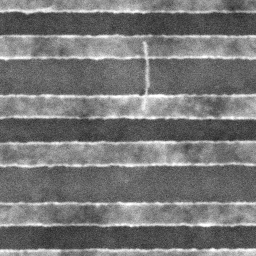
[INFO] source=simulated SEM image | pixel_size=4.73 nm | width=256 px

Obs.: lines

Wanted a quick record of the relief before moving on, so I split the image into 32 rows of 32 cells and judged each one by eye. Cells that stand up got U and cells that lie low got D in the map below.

UUUUUUUUUUUUUUUUUUUUUUUUUUUUUUUU
DDDUDDDDDDDDDDUDUUDDDUDUUUDDUDDU
DDDDDDDDDDDDDDDDDDDDDDDDDDDDDDDD
DDDDDDDDDDDDDDDDDDDDDDDDDDDDDDDD
DDDDDDDDDDDDDDUDDDDDUDDDDDDDDDDD
UUUUUUUUUUUUUUUUUUUUUUUUUUUUUUUU
UUUUUUUUUUUUUUUUUUUUUUUUUUUUUUUU
DDDDDDDDDDDDDDDDDDDDDDDDDDDDDDDD
DDDDDDDDDDDDDDDDDDDDDDDDDDDDDDDD
DDDDDDDDDDDDDDDDDDDDDDDDDDDDDDDD
DDDDDDDDDDDDDDDDDDDDDDDDDDDDDDDD
DDDDDDDDDDDDDDDDDDDDDDDDDDDDDDDD
UUUUUUUUUUUUUUUUUUUUUUUUUUUUUUUU
UUUUUUUUUUUUUUUUUUUUUUUUUUUUUUUU
UUUUUUUUUUUUUUUUUUUUUUUUUUUUUUUU
DDDDDDDDDDDDDDDDDDDDDDDDDDDDDDDD
DDDDDDDDDDDDDDDDDDDDDDDDDDDDDDDD
DDDDDDDDDDDDDDDDDDDDDDDDDDDDDDDD
UUUUUUUUUUUUUUUUUUUUUUUUUUUUUUUU
UUUUUUUUUUUUUUUUUUUUUUUUUUUUUUUU
UUUUUUUUUUUUUUUUUUUUUUUUUUUUDDUU
DDDDDDDDDDDDDDDDDDDDDDDDDDDDDDDD
DDDDDDDDDDDDDDDDDDDDDDDDDDDDDDDD
DDDDDDDDDDDDDDDDDDDDDDDDDDDDDDDD
DDDDDDDDDDDDDDDDDDDDDDDDDDDDDDDD
UUUUUUUUUUUUUUUUUUUUUUUUUUUUUUUU
UUUUUUUUUUUUUUUUUUUUUUUUUUUUUUUU
UUUUUUUUUUUUUUUUUUUUUUUUUUUUUUUU
DDDDDDDDDDDDDDDDDDDDDDDDDDDDDDDD
DDDDDDDDDDDDDDDDDDDDDDDDDDDDDDDD
DDDDDDDDDDDDDDDDDDDDDDDDDDDDDDDD
UUUUUUUUUUUUUUUUUUUUUUUUUUUUUUUU